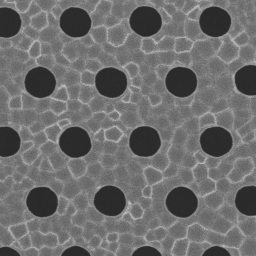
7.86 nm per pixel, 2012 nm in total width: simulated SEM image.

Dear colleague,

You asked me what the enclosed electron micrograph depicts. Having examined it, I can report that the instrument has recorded a regular array of holes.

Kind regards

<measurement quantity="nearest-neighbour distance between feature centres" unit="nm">541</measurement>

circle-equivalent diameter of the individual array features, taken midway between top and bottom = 246 nanometers